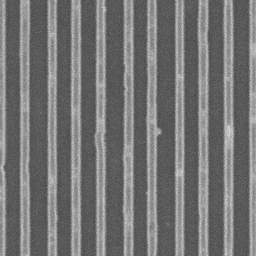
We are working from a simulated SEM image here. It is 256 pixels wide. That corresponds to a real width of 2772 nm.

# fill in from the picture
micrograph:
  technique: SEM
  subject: parallel lines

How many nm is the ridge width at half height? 74.4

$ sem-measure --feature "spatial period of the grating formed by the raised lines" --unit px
25.4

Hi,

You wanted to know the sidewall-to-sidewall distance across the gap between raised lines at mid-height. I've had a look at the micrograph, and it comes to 196 nanometers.